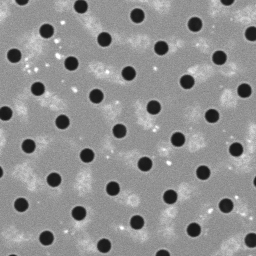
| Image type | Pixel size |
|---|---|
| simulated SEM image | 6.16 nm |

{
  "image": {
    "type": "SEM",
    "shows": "a regular array of holes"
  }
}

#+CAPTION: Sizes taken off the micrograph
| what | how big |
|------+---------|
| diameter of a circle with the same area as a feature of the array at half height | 89.5 nm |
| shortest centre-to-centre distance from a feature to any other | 250 nanometres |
